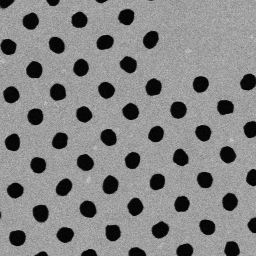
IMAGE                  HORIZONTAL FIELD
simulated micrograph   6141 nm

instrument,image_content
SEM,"a regular array of holes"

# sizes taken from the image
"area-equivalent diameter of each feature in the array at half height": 388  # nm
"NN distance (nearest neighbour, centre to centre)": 788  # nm